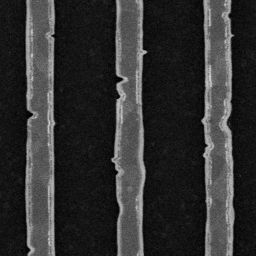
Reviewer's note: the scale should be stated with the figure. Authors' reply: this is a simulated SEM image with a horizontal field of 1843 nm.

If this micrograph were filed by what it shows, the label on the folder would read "one or a few lines or trenches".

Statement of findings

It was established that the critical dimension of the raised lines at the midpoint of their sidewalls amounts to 171 nanometers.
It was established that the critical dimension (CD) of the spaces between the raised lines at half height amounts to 468 nm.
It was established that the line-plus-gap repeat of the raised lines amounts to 89 pixels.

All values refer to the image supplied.